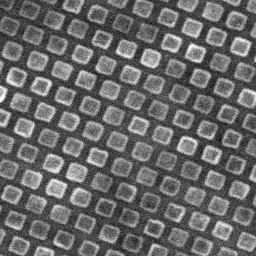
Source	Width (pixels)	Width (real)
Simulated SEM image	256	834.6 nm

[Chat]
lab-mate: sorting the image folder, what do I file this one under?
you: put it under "a regular array of raised bodies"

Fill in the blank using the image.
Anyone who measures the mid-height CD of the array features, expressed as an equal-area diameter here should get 58.5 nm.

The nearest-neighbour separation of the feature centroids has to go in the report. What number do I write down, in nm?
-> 82.8